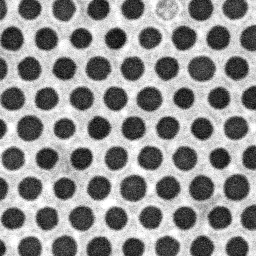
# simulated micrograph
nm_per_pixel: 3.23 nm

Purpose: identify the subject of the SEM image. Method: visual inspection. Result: a regular array of holes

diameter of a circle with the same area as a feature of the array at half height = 82.7 nanometres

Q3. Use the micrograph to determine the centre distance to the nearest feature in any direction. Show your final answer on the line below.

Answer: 0.11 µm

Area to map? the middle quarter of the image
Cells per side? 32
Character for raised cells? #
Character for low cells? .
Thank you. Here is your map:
...##.......##......##.......##.
...##.......##......##.......##.
...##.......##......###......##.
..####.....####....#####....####
################..#######.######
####.#######.#######..##########
##.....###.....####.....####....
#......###......##.......##.....
#.......##......##.......##.....
#......###......##.......##.....
##.....###......##......####....
###...#####....####.....########
################################
..#####....#####...#####....####
...###.....####.....###......###
...###......##......###......###
...###......##......###......###
...###.....###......###......###
..#####...#####....#####....####
################################
############..######...######..#
##.....####.....###.....####....
##.....###......##.......##.....
#.......##......##.......##.....
#......###......##.......##.....
##.....###.....####.....###.....
###..######...######...#####....
################################
.######....####.....####....####
...###......##.......##......##.
...##.......##.......##......##.
...##.......##.......##......##.